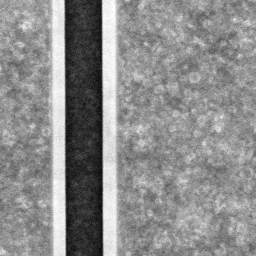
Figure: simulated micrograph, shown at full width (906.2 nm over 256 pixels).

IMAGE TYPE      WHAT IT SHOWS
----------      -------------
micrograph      one or a few lines or trenches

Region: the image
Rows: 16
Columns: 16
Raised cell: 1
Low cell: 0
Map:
1111000111111111
1111000111111111
1111000111111111
1111000111111111
1111000111111111
1111000111111111
1111000111111111
1111000111111111
1111000111111111
1111000111111111
1111000111111111
1111000111111111
1111000111111111
1111000111111111
1111000111111111
1111000111111111